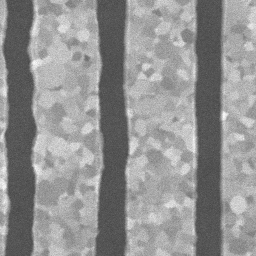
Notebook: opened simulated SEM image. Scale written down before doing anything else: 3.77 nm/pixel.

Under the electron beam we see one or a few lines or trenches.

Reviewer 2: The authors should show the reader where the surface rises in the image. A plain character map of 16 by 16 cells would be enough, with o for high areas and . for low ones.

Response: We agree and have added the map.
..oooo..oooo..oo
..oooo..oooo..oo
..oooo..oooo..oo
..oooo..oooo..oo
..oooo..oooo..oo
..oooo..oooo..oo
..oooo..oooo..oo
..oooo..oooo..oo
..oooo..oooo..oo
..oooo..oooo..oo
..oooo..oooo..oo
..oooo..oooo..oo
o.oooo..oooo..oo
..oooo..oooo..oo
..oooo..oooo..oo
..oooo..oooo..oo